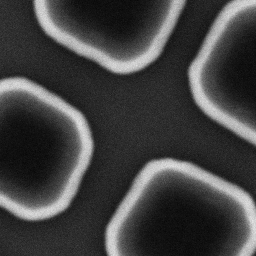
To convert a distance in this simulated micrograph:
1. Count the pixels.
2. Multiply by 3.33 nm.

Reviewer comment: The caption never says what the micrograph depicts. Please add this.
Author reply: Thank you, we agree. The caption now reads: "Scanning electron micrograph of raised bodies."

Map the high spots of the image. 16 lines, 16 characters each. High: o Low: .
...oooooooo....o
...oooooooo...oo
....oooooo...ooo
......ooo....ooo
............oooo
oo..........oooo
oooo.........ooo
ooooo.........oo
ooooo...........
ooooo...........
ooooo.....oo....
ooooo....ooooo..
oooo....ooooooo.
.......ooooooooo
.......ooooooooo
.......ooooooooo